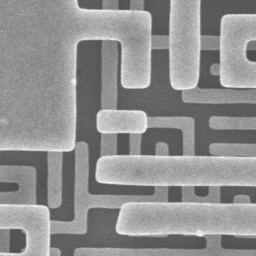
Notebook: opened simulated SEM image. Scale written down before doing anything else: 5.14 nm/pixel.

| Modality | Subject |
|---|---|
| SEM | wiring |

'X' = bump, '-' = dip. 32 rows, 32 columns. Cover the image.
XXXXXXXXXX-----------XXXX-------
XXXXXXXXXXXXXXXXXX---XXXX-------
XXXXXXXXXXXXXXXXXXX--XXXX---XXXX
XXXXXXXXXXXXXXXXXXX--XXXX---XXXX
XXXXXXXXXXXXXXXXXXX--XXXX---XXXX
XXXXXXXXXX-----XXXX--XXXX---XXX-
XXXXXXXXX------XXXX--XXXX---XXX-
XXXXXXXXX------XXXX--XXXX---XXX-
XXXXXXXXX------XXXX--XXXX---XXXX
XXXXXXXXX------XXXX--XXXX---XXXX
XXXXXXXXX------XXXX--XXXX---XXXX
XXXXXXXXX-----------------------
XXXXXXXXX-----------------------
XXXXXXXXX-----------------------
XXXXXXXXX---XXXXXX--------------
XXXXXXXXX---XXXXXX--------------
XXXXXXXXX----XXXXX--------------
XXXXXXXXX-----------------------
XXXXXXXXX-----------------------
-------------XXXXXXX------------
------------XXXXXXXXXXXXXXXXXXXX
------------XXXXXXXXXXXXXXXXXXXX
------------XXXXXXXXXXXXXXXXXXXX
--------------------------------
--------------------------------
----------------XXXXXXXXXXXXXXXX
XXXXXX---------XXXXXXXXXXXXXXXXX
XXXXXX---------XXXXXXXXXXXXXXXXX
XXXXXX---------XXXXXXXXXXXXXXXXX
---XXX--------------------------
---XXX--------------------------
---XXX--------------------------